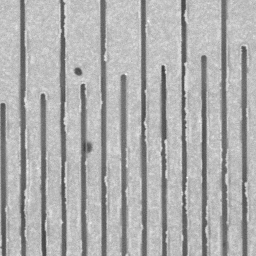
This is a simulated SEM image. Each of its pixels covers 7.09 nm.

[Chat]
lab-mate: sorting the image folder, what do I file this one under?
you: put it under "parallel lines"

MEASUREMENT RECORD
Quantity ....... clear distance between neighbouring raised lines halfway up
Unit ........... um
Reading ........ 0.0346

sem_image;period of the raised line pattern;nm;143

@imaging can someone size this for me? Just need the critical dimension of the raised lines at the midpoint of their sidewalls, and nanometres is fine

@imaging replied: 103